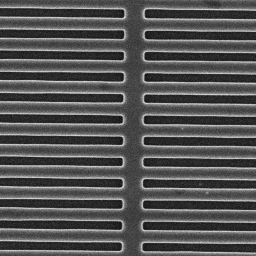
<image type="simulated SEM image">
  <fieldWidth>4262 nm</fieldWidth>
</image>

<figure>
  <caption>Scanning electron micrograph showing groups of lines, slits or small figures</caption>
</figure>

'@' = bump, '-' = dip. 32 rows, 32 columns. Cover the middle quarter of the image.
@@@@@@@@@@@@@@@@@@@@@@@@@@@@@@@@
@@@@@@@@@@@@@@@@@@@@@@@@@@@@@@@@
---------------@@@@@------------
---------------@@@@@------------
@@@@@@@@@@@---@@@@@@@-----------
@@@@@@@@@@@@@@@@@@@@@@@@@@@@@@@@
@@@@@@@@@@@@@@@@@@@@@@@@@@@@@@@@
--------------@@@@@@@-----------
---------------@@@@@------------
---------------@@@@@------------
@@@@@@@@@@@@@@@@@@@@@@@@@@@@@@@@
@@@@@@@@@@@@@@@@@@@@@@@@@@@@@@@@
@@@@@@@@@@@@@@@@@@@@@@@@@@@@@@@@
---------------@@@@@------------
---------------@@@@@------------
@@@@@@@@@@@@@@@@@@@@@@@@@@@@@@@@
@@@@@@@@@@@@@@@@@@@@@@@@@@@@@@@@
@@@@@@@@@@@@@@@@@@@@@@@@@@@@@@@@
---------------@@@@@------------
---------------@@@@@------------
@@@@@@@@@@@@@@@@@@@@@-----------
@@@@@@@@@@@@@@@@@@@@@@@@@@@@@@@@
@@@@@@@@@@@@@@@@@@@@@@@@@@@@@@@@
--------------@@@@@@------------
---------------@@@@@------------
--------------@@@@@@------------
@@@@@@@@@@@@@@@@@@@@@@@@@@@@@@@@
@@@@@@@@@@@@@@@@@@@@@@@@@@@@@@@@
--------------@@@@@@@@@@@@@@@@@@
---------------@@@@@------------
---------------@@@@@------------
@@@@@@@@@@@@@@@@@@@@@@@@@@@@@@@@